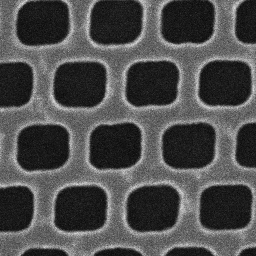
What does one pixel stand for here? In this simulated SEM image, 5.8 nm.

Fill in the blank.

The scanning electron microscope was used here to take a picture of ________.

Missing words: a regular array of holes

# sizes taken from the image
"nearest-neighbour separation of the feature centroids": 416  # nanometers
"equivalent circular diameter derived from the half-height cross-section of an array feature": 0.308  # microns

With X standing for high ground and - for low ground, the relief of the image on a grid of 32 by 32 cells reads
XXX-----XXXX------XXX------XXX--
XX-------XX-------XX-------XX---
XX-------XX-------XX-------XX---
XX-------XX-------XX-------XX---
XX------XXX------XXX-------XX---
XXX----XXXXX----XXXXXX-X-XXXXXX-
XXXXXXXXXXXXXXXXXXXXXXXXXXXXXXXX
XXXXXXXXXXXXXXXXXXXXXXXXXXX---XX
----XXX------XXX------XXX------X
----XXX------XXX------XXX-------
----XXX------XXX------XXX-------
----XXX------XXX------XXX------X
----XXX------XXX------XXX------X
-XXXXXXXXX-XXXXXXXXXXXXXXXXXXXXX
XXXXXXXXXXXXXXXXXXXXXXXXXXXXXXXX
XXXXX--XXXXXXXX--XXXXX----XXXXX-
XXX------XX-------XXX------XXX--
XX-------XX-------XX-------XXX--
XX-------XX-------XX-------XX---
XX-------XX-------XX-------XX---
XX------XXX------XXXX-----XXXX--
XXXXXXXXXXXXXXXXXXXXXXXXXXXXXXXX
XXXXXXXXXXXXXXXXXXXXXXXXXXXXXXXX
----XXXX-----XXXX-----XXXX-----X
----XXX------XXX------XXX-------
----XXX------XXX-------XX-------
----XXX------XXX------XXX------X
----XXX------XXX------XXX------X
---XXXX------XXX-----XXXXX----XX
XXXXXXXXXXXXXXXXXXXXXXXXXXXXXXXX
XXXXXXXXXXXXXXXXXXXXXXXXXXXXXXXX
XXX-----XXXX-----XXXX-----XXXX--